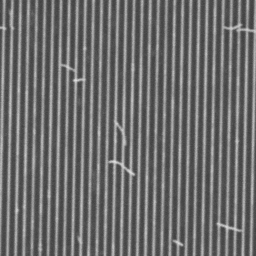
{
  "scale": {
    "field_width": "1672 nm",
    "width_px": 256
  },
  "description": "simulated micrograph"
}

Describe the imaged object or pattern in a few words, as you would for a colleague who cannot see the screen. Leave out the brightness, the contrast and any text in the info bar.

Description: parallel lines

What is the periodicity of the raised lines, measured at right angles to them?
53 nm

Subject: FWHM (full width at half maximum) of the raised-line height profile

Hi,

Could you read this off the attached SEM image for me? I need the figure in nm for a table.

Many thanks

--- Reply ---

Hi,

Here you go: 12.2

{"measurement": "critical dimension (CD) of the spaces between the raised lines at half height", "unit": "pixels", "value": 6.37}